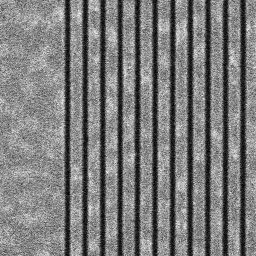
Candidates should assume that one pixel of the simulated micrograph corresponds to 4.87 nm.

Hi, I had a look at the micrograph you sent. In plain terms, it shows parallel lines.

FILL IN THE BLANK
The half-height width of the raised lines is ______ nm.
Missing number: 59.1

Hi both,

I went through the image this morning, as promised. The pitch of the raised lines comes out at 0.0853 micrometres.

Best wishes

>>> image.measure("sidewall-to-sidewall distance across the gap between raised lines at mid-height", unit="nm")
25